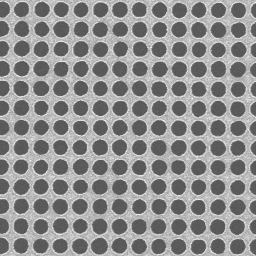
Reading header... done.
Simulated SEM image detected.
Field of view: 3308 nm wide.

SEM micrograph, a regular array of holes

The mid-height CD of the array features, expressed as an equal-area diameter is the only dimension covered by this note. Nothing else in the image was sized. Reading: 199 nm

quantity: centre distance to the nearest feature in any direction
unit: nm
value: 251